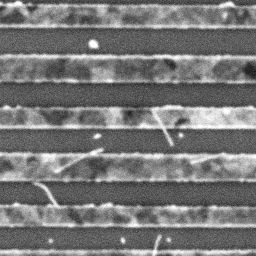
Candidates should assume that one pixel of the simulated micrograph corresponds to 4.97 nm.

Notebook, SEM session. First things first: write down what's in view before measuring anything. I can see lines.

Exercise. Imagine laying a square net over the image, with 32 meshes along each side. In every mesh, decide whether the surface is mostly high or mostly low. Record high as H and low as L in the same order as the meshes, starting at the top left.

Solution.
LLHLLLLLLLLLLLLLLLLLLLLLLLLLHLLL
HHHHHHHHHHHHHHHHHHHHHHHHHHHHHHHH
HHHHHHHHHHHHHHHHHHHHHHHHHHHHHHHH
LLLLLLLLLLLLLLLLLLLLLLLLLLLLLLLL
LLLLLLLLLLLLLLLLLLLLLLLLLLLLLLLL
LLLLLLLLLLLLLLLLLLLLLLLLLLLLLLLL
LLLLLLLLLLLLLLLLLLLLLLLLLLLLLLLL
HHHHHHHHHHHHHHHHHHHHHHHHHHHHHHHH
HHHHHHHHHHHHHHHHHHHHHHHHHHHHHHHH
HHHHHHHHHHHHHHHHHHHHHHHHHHHHHHHH
LLLLLLLLLLLLLLLLLLLLLLLLLLLLLLLL
LLLLLLLLLLLLLLLLLLLLLLLLLLLLLLLL
LLLLLLLLLLLLLLLLLLLLLLLLLLLLLLLL
HLLLLLLLLLLLLLLLLLLLHHHLLLLLLLLH
HHHHHHHHHHHHHHHHHHHHHHHHHHHHHHHH
HHHHHHHHHHHHHHHHHHHHHHHHHHHHHHHH
LLLLLLLLLLLLLLLLLLLLLLLLLLLLLLLL
LLLLLLLLLLLLLLLLLLLLLLLLLLLLLLLL
LLLLLLLLLLLLLLLLLLLLLLLLLLLLLLLL
HHHHLHHHHHHHHHHHHHLLLLLLLLLLLLLL
HHHHHHHHHHHHHHHHHHHHHHHHHHHHHHHH
HHHHHHHHHHHHHHHHHHHHHHHHHHHHHHHH
LLLLHLLLHLLLHHLLLHLLLLHLHHHLLLLH
LLLLLLLLLLLLLLLLLLLLLLLLLLLLLLLL
LLLLLLLLLLLLLLLLLLLLLLLLLLLLLLLL
LLLLLLLLLLLLLLLLLLLLLLLLLLLLLLLL
HHHHHHHHHHHHHHHHHHHHHHHHHHHHHHHH
HHHHHHHHHHHHHHHHHHHHHHHHHHHHHHHH
LLLLLLLLLLLLLLLLLLLLLLLLLLLLLLLL
LLLLLLLLLLLLLLLLLLLLLLLLLLLLLLLL
LLLLLLLLLLLLLLLLLLLLLLLLLLLLLLLL
HHHHHHHHLLLLHHHHHHHHHHHHHHHHHHHH